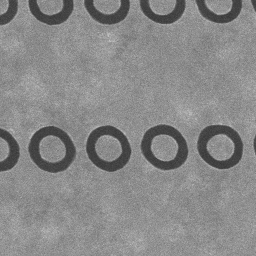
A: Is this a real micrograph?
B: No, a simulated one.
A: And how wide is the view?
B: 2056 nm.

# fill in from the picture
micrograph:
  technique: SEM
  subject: ring-shaped grooves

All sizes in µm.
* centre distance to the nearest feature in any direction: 0.448